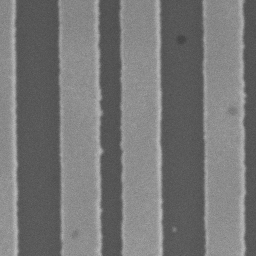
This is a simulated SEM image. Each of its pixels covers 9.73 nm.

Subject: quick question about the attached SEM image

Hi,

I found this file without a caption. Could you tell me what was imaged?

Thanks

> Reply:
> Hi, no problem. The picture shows lines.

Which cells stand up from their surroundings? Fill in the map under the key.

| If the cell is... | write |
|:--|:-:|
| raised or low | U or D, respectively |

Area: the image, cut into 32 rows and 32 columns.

UUDDDDDUUUUUDDDUUUUUDDDDDUUUUUDD
UUDDDDDDUUUUDDDUUUUUDDDDDUUUUUDD
UUDDDDDDUUUUDDDUUUUUDDDDDUUUUUDD
UUDDDDDDUUUUDDDUUUUUDDDDDUUUUUDD
UUDDDDDDUUUUDDDUUUUUDDDDDDUUUUDD
UUDDDDDDUUUUDDDUUUUUDDDDDDUUUUDD
UUDDDDDDUUUUDDDUUUUUDDDDDDUUUUDD
UUDDDDDDUUUUDDDUUUUUDDDDDDUUUUDD
UUDDDDDDUUUUDDDUUUUUDDDDDUUUUUDD
UUDDDDDDUUUUDDDUUUUUDDDDDUUUUUDD
UUDDDDDDUUUUDDDUUUUUDDDDDDUUUUUD
UUDDDDDDUUUUDDDUUUUUDDDDDDUUUUDD
UUDDDDDDUUUUDDDUUUUUDDDDDUUUUUDD
UUDDDDDDUUUUDDDUUUUUDDDDDDUUUUDD
UUDDDDDDUUUUDDDUUUUUDDDDDDUUUUDD
UUDDDDDDUUUUDDDUUUUUDDDDDDUUUUDD
UUDDDDDDUUUUDDDUUUUUDDDDDDUUUUDD
UUDDDDDDUUUUDDDUUUUUDDDDDDUUUUDD
UUDDDDDDUUUUDDDUUUUUDDDDDDUUUUDD
UUDDDDDDUUUUDDDUUUUUDDDDDDUUUUUD
UUDDDDDDUUUUDDDUUUUUDDDDDDUUUUDD
UUDDDDDDUUUUDDDUUUUUDDDDDDUUUUUD
UUDDDDDDUUUUUDDUUUUUDDDDDDUUUUUD
UUDDDDDDUUUUUDDUUUUUDDDDDDUUUUUD
UUDDDDDDUUUUUDDUUUUUDDDDDDUUUUUD
UUDDDDDDUUUUDDDUUUUUDDDDDDUUUUDD
UUDDDDDDUUUUDDDUUUUUDDDDDDUUUUDD
UUDDDDDDUUUUUDDUUUUUDDDDDDUUUUDD
UUDDDDDDUUUUUDDUUUUUDDDDDDUUUUUD
UUDDDDDDUUUUUDDUUUUUDDDDDDUUUUDD
UUDDDDDDUUUUUDDUUUUUDDDDDDUUUUUD
UUDDDDDDUUUUUDDUUUUUDDDDDDUUUUUD